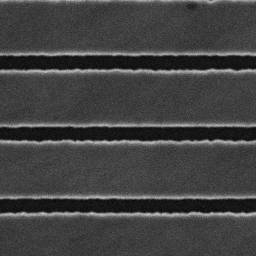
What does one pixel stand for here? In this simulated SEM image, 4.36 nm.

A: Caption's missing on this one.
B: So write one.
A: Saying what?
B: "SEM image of lines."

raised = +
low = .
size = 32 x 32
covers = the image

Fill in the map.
++++++++++++++++++++++++++++++++
++++++++++++++++++++++++++++++++
++++++++++++++++++++++++++++++++
++++++++++++++++++++++++++++++++
++++++++++++++++++++++++++++++++
++++++++++++++++++++++++++++++++
++++++++++++++++++++++++++++++++
................................
................................
++++++++++++++++++++++++++++++++
++++++++++++++++++++++++++++++++
++++++++++++++++++++++++++++++++
++++++++++++++++++++++++++++++++
++++++++++++++++++++++++++++++++
++++++++++++++++++++++++++++++++
++++++++++++++++++++++++++++++++
................................
+.......+..................+....
++++++++++++++++++++++++++++++++
++++++++++++++++++++++++++++++++
++++++++++++++++++++++++++++++++
++++++++++++++++++++++++++++++++
++++++++++++++++++++++++++++++++
++++++++++++++++++++++++++++++++
++++++++++++++++++++++++++++++++
................................
................................
++++++++++++++++++++++++++++++++
++++++++++++++++++++++++++++++++
++++++++++++++++++++++++++++++++
++++++++++++++++++++++++++++++++
++++++++++++++++++++++++++++++++